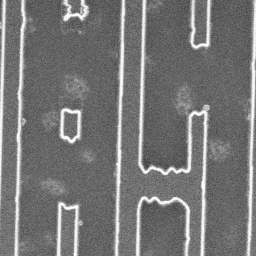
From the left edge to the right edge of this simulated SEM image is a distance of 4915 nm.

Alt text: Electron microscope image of one or a few lines or trenches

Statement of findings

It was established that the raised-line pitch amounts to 1.22 µm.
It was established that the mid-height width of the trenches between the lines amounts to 897 nm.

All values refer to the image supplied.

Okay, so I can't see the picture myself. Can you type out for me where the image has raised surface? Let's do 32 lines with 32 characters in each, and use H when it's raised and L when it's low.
LHHLLLLLHHLLLLLHHHLLLLLLHHLLLLLL
LHHLLLLLLHHLLLLHHHLLLLLLHHLLLLLL
LHHLLLLLLLLLLLLHHHLLLLLLHHLLLLLL
LHHLLLLLLLLLLLLHHHLLLLLLHHLLLLLL
LHHLLLLLLLLLLLLHHHLLLLLLHHLLLLLL
HHHLLLLLLLLLLLLHHHLLLLLLHHLLLLLL
HHHLLLLLLLLLLLLHHHLLLLLLLLLLLLLL
HHHLLLLLLLLLLLLHHHLLLLLLLLLLLLLL
HHHLLLLLLLLLLLLHHHLLLLLLLLLLLLLL
HHHLLLLLLLLLLLLHHHLLLLLLLLLLLLLL
HHLLLLLLLLLLLLLHHHLLLLLLLLLLLLLL
HHLLLLLLLLLLLLLHHHLLLLLLLLLLLLLL
HHLLLLLLLLLLLLLHHHLLLLLLLLLLLLLL
HHLLLLLLLLLLLLLHHHLLLLLLLLLLLLLL
HHLLLLLLHHLLLLLHHHLLLLLLHHLLLLLL
HHLLLLLLHHLLLLLHHHLLLLLLHHLLLLLL
HHLLLLLLHHLLLLLHHLLLLLLLHHLLLLLL
HHLLLLLLLLLLLLLHHLLLLLLLHHLLLLLH
HHLLLLLLLLLLLLLHHLLLLLLLHHLLLLLH
HHLLLLLLLLLLLLLHHLLLLLLLHHLLLLLH
HHLLLLLLLLLLLLLHHHLLLLLLHLLLLLLH
HHLLLLLLLLLLLLLHHHHHHHHHHHLLLLLH
HHLLLLLLLLLLLLLHHHHHHHHHHLLLLLLH
HHLLLLLLLLLLLLLHHHHHHHHHHLLLLLLH
HHLLLLLLLLLLLLLHHHHHHHHHHLLLLLLH
HHLLLLLLLLLLLLLHHHLLLLLHHLLLLLLH
HHLLLLLLHHLLLLLHHLLLLLLLHLLLLLLH
HHLLLLLLHHLLLLLHHLLLLLLHHLLLLLLH
HHLLLLLLHHLLLLLHHLLLLLLHHLLLLLLH
HHLLLLLHHHLLLLLHHLLLLLLHHLLLLLLH
HHLLLLLHHLLLLLLHHLLLLLLHHLLLLLLH
HHLLLLLHHLLLLLLHHLLLLLLHHLLLLLLH